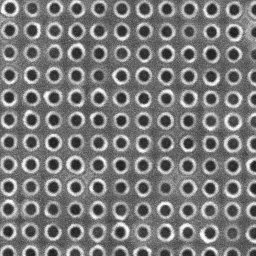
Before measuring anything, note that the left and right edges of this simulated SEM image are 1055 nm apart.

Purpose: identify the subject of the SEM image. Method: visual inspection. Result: a regular array of holes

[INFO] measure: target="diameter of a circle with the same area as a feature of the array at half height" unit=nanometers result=44.4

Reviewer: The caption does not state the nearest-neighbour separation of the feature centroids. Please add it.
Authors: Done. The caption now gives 91.3 nanometres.